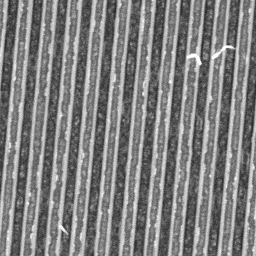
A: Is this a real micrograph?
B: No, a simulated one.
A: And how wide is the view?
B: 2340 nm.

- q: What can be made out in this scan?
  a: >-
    parallel lines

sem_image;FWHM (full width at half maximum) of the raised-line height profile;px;11.2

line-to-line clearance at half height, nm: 121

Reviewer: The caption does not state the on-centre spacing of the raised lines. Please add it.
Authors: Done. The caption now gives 24.5 pixels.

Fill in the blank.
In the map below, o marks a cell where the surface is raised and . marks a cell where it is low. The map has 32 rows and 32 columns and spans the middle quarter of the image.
ooo...ooo...ooo...ooo....oo....o
ooo...ooo...ooo...ooo...ooo....o
ooo...ooo...ooo...ooo...ooo...oo
oo....ooo...ooo...ooo...ooo...oo
oo....oo....ooo...ooo...ooo...oo
oo....oo....oo....ooo...ooo...oo
oo....oo....oo....ooo...ooo...oo
oo....oo....oo....oo....ooo...oo
oo...ooo....oo....oo....oo....oo
oo...ooo...ooo....oo....oo....oo
oo...ooo...ooo....oo....oo....oo
o....ooo...ooo...ooo....oo....oo
o....ooo...ooo...ooo...ooo....oo
oo...ooo...ooo...ooo...ooo....oo
o....ooo...ooo...ooo...ooo...ooo
o....oo....ooo...ooo...ooo...ooo
o....oo....oo....ooo...ooo...ooo
o....oo....oo....ooo...ooo...ooo
o....oo....oo....oo....ooo...ooo
o...ooo....oo....oo....oo....ooo
o...ooo...ooo....oo....oo....oo.
o...ooo...ooo....oo....oo....ooo
o...ooo...ooo...ooo....oo....ooo
o...ooo...ooo...ooo...ooo....oo.
o...ooo...ooo...ooo...ooo...ooo.
....ooo...ooo...ooo...ooo...ooo.
....oo....ooo...ooo...ooo...ooo.
....oo....oo....ooo...ooo...ooo.
....oo....oo....ooo...ooo...ooo.
....oo....oo....oo....ooo...ooo.
...ooo....oo....oo....oo....ooo.
...ooo...ooo....oo....oo....oo..